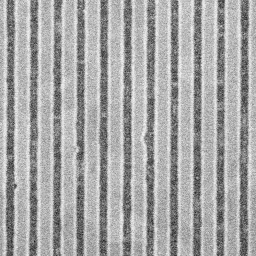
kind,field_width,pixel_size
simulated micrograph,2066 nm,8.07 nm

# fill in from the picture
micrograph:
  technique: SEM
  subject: parallel lines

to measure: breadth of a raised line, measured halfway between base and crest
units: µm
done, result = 0.109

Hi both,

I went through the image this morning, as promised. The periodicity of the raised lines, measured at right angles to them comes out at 188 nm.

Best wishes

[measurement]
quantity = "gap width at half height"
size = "78.6 nm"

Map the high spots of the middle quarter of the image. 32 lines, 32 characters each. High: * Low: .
***...***..****..***...***...***
***...***..****..***...***...***
***...***..****..***...***...***
***...***..***...***...***...***
***...***..***...***...***...***
***...***..****..***...***...***
***...**...****..***...***...***
***..***...****..***...***...***
***...**...****..***...***...***
***...***..****..***...***...***
***...***..***...***...***...***
***...***..***...***...***...***
***...***..****..***...***...***
***...***..***...***...***...***
**....**...****..***...***...***
**...***...***...***...***...***
***..***...***...***...***...***
***..***...***...***...***...***
***..***...***...***...***...***
***...**...***...***...***...***
***...***..***...***...***...***
***...**...***...***...***...***
***...**...***...***...***...***
***...**...***...***...***...***
***...**...***...***...***...***
***...***..***...***...***...***
***...***..***...***...***...***
***...***..***...***...***...***
***...**...***...***...***...***
***...***..***...***...***...***
***...**...***...***...***...***
***...**...***...***...***...***